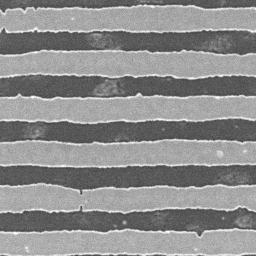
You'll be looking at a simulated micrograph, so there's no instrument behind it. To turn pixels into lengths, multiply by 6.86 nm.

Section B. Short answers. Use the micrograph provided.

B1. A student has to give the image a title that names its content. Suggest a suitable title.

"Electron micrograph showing parallel lines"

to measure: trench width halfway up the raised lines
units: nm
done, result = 144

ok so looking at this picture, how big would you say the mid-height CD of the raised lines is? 164 nm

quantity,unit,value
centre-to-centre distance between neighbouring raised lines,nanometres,306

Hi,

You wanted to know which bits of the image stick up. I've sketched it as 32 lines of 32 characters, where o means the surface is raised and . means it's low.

................................
oooooooooooooooooooooooooooooooo
oooooooooooooooooooooooooooooooo
oooooooooooooooooooooooooooooooo
................................
................................
....ooooooooooooooo...ooo.......
oooooooooooooooooooooooooooooooo
oooooooooooooooooooooooooooooooo
o............ooooo..oooooooo...o
.............o..................
............oo..................
oooooooooooooooooooooooooooooooo
oooooooooooooooooooooooooooooooo
oooooooooooooooooooooooooooooooo
................................
....o...........................
....o...............ooo.........
oooooooooooooooooooooooooooooooo
oooooooooooooooooooooooooooooooo
oooooooooooooooooooooooooooooooo
................................
................................
ooooooooo....oo.oooooooooooooooo
oooooooooooooooooooooooooooooooo
oooooooooooooooooooooooooooooooo
ooo............o................
..............................o.
..............................o.
oooooooooooooooooooooooooooooooo
oooooooooooooooooooooooooooooooo
oooooooooooooooooooooooooooooooo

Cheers